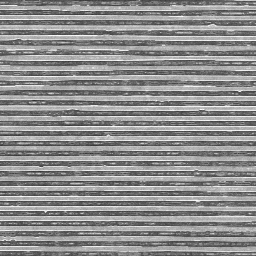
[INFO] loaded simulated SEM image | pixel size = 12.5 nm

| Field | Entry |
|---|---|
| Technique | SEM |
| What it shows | parallel lines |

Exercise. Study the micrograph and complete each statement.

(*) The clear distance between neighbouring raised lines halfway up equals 73.4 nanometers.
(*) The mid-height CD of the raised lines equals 53.1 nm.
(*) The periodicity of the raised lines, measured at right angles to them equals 126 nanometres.